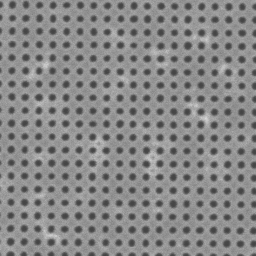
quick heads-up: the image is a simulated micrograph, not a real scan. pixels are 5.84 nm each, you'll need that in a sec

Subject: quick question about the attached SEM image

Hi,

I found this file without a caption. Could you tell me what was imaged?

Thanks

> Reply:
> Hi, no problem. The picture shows a regular array of holes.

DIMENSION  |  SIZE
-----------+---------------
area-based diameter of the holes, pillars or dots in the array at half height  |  42.7 nanometres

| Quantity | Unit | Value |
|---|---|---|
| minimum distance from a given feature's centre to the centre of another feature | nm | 75.7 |